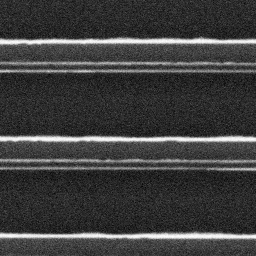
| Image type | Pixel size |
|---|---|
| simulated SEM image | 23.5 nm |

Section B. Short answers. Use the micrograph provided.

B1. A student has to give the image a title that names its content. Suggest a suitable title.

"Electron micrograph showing lines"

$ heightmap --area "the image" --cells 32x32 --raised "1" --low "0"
00000000000000000000000000000000
00000000000000000000000000000000
00000000000000000000000000000000
00000000000000000000000000000000
00000000000000000000000000000000
11111111111111111111111111111111
11111111111111111111111111111111
11111111111111111111111111111111
11111111111111111111111111111111
00000000000000000000000000000000
00000000000000000000000000000000
00000000000000000000000000000000
00000000000000000000000000000000
00000000000000000000000000000000
00000000000000000000000000000000
00000000000000000000000000000000
00000000000000000000000000000000
11111111111111111111111110011111
11111111111111111111111111111111
11111111111111111111111111111111
11111111111111111111111111111111
00000000000000000000000000000000
00000000000000000000000000000000
00000000000000000000000000000000
00000000000000000000000000000000
00000000000000000000000000000000
00000000000000000000000000000000
00000000000000000000000000000000
00000000000000000000000000000000
00000000000000000000000000000000
11111111111111111111111111111111
11111111111111111111111111111111